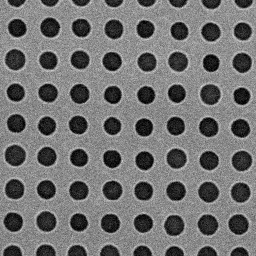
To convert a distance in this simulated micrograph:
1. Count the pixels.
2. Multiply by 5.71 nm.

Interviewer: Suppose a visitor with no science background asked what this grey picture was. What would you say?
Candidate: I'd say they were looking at a regular array of holes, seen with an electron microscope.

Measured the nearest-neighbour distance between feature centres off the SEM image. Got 180 nanometres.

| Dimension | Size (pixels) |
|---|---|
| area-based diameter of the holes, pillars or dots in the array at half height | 19.6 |